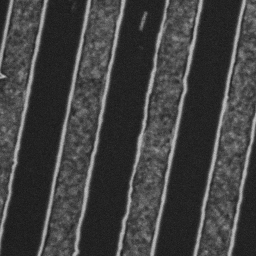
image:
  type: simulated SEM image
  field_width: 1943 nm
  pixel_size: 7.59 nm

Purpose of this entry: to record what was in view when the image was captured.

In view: one or a few lines or trenches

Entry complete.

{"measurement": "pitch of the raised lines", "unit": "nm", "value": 578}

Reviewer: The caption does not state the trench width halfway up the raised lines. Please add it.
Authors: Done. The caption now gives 244 nm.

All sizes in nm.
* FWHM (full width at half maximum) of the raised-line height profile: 334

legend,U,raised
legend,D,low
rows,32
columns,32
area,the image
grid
UDDDDDUUUUUDDDDUUUUUUDDDDUUUUUUD
UDDDDUUUUUUDDDDUUUUUUDDDDUUUUUDD
UDDDDUUUUUUDDDDUUUUUUDDDDUUUUUDD
UDDDDUUUUUUDDDDUUUUUDDDDUUUUUUDD
UDDDDUUUUUDDDDUUUUUUDDDDUUUUUUDD
UDDDDUUUUUDDDDUUUUUUDDDDUUUUUUDD
DDDDUUUUUUDDDDUUUUUUDDDDUUUUUDDD
DDDDUUUUUUDDDDUUUUUUDDDDUUUUUDDD
DDDDUUUUUUDDDDUUUUUDDDDUUUUUUDDD
DDDDUUUUUDDDDUUUUUUDDDDUUUUUUDDD
DDDDUUUUUDDDDUUUUUUDDDDUUUUUUDDD
DDDUUUUUUDDDDUUUUUUDDDDUUUUUDDDD
DDDUUUUUUDDDDUUUUUDDDDDUUUUUDDDD
DDDUUUUUUDDDDUUUUUDDDDUUUUUUDDDD
DDDUUUUUDDDDDUUUUUDDDDUUUUUUDDDD
DDDUUUUUDDDDUUUUUUDDDDUUUUUUDDDD
DDUUUUUUDDDDUUUUUUDDDDUUUUUDDDDD
DDUUUUUUDDDDUUUUUUDDDDUUUUUDDDDU
DDUUUUUUDDDDUUUUUDDDDDUUUUUDDDDU
DDUUUUUUDDDDUUUUUDDDDUUUUUUDDDDU
DDUUUUUDDDDUUUUUUDDDDUUUUUUDDDDU
DDUUUUUDDDDUUUUUUDDDDUUUUUDDDDUU
DUUUUUUDDDDUUUUUUDDDDUUUUUDDDDUU
DUUUUUUDDDDUUUUUDDDDDUUUUUDDDDUU
DUUUUUUDDDDUUUUUDDDDUUUUUUDDDDUU
DUUUUUDDDDUUUUUUDDDDUUUUUUDDDDUU
DUUUUUDDDDUUUUUUDDDDUUUUUDDDDDUU
UUUUUUDDDDUUUUUUDDDDUUUUUDDDDUUU
UUUUUUDDDDUUUUUUDDDDUUUUUDDDDUUU
UUUUUUDDDDUUUUUDDDDUUUUUUDDDDUUU
UUUUUDDDDDUUUUUDDDDUUUUUUDDDDUUU
UUUUUDDDDUUUUUUDDDDUUUUUUDDDDUUU